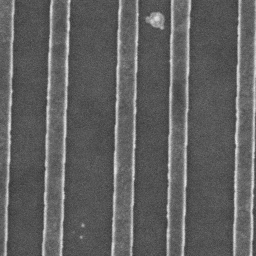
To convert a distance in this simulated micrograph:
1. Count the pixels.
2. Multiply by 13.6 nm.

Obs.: lines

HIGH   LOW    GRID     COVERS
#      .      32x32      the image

##....###......##....###......##
##....###......##....###......##
##....###......##....###......##
##....###......##....###......##
##....###......##....###......##
#.....###......##....###......##
#.....###......##....###......##
#.....##.......##....###......##
#.....##.......##....###......##
#.....##.......##....##.......##
#.....##.......##....##.......##
#.....##.......##....##.......##
#.....##.......##....##.......##
#.....##.......##....##.......##
#.....##.......##....##.......##
#.....##......###....##.......##
#.....##......###....##......###
#.....##......###....##......###
#.....##......###....##.......##
#.....##......###....##......###
#.....##......###....##......###
#.....##......###....##......###
#.....##......###....##......###
#.....##......###....##......###
#.....##......###....##......###
#.....##......###....##......###
#.....##......###....##......##.
#.....##......###....##......###
#....###......###....##......###
#....###......###....##......###
#....###......###....##......##.
#....###......##.....##......##.